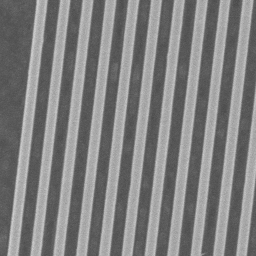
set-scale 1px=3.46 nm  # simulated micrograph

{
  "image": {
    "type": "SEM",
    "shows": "parallel lines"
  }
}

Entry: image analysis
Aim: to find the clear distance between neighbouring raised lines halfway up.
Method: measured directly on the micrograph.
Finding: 0.0439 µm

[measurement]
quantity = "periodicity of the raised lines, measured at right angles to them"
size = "78.7 nanometres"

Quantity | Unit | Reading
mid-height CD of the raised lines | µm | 0.0344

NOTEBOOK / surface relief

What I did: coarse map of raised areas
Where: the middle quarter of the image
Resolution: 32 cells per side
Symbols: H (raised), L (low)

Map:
LLLHHLLLLHHLLLHHHLLLHHLLLLHHLLLH
LLLHHLLLLHHLLLHHHLLLHHLLLLHHLLLH
LLLHHLLLHHHLLLHHLLLLHHLLLHHHLLLH
LLLHHLLLHHHLLLHHLLLLHHLLLHHHLLLH
LLHHHLLLHHHLLLHHLLLLHHLLLHHHLLLH
LLHHHLLLHHLLLLHHLLLHHHLLLHHLLLLH
LLHHHLLLHHLLLLHHLLLHHHLLLHHLLLLH
LLHHLLLLHHLLLLHHLLLHHHLLLHHLLLLH
LLHHLLLLHHLLLHHHLLLHHLLLLHHLLLHH
LLHHLLLLHHLLLHHHLLLHHHLLLHHLLLHH
LLHHLLLHHHLLLHHHLLLHHLLLLHHLLLHH
LLHHLLLHHHLLLHHLLLLHHLLLHHHLLLHH
LLHHLLLHHHLLLHHLLLLHHLLLHHHLLLHH
LHHHLLLHHLLLLHHLLLLHHLLLHHHLLLHH
LHHHLLLHHLLLLHHLLLHHHLLLHHHLLLHH
LHHHLLLHHLLLLHHLLLHHHLLLHHHLLLHH
LHHLLLLHHLLLHHHLLLHHHLLLHHLLLLHH
LHHLLLLHHLLLHHHLLLHHLLLLHHLLLHHH
LHHLLLLHHLLLHHHLLLHHLLLLHHLLLHHH
LHHLLLHHHLLLHHHLLLHHLLLLHHLLLHHH
LHHLLLHHHLLLHHHLLLHHLLLHHHLLLHHH
LHHLLLHHHLLLHHLLLLHHLLLHHHLLLHHH
HHHLLLHHLLLLHHLLLHHHLLLHHHLLLHHL
HHHLLLHHLLLLHHLLLHHHLLLHHLLLLHHL
HHHLLLHHLLLLHHLLLHHHLLLHHLLLLHHL
HHLLLLHHLLLHHHLLLHHLLLLHHLLLLHHL
HHLLLLHHLLLHHHLLLHHLLLLHHLLLHHHL
HHLLLLHHLLLHHHLLLHHLLLLHHLLLHHHL
HHLLLHHHLLLHHLLLLHHLLLHHHLLLHHHL
HHLLLHHHLLLHHLLLLHHLLLHHHLLLHHHL
HHLLLHHHLLLHHLLLLHHLLLHHHLLLHHHL
HHLLLHHLLLLHHLLLHHHLLLHHLLLLHHLL